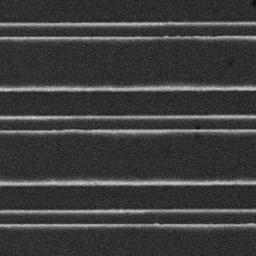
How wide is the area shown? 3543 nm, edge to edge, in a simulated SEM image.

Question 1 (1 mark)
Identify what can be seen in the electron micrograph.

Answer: lines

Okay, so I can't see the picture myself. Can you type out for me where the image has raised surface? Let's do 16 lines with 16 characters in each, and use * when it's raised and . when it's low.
................
................
****************
****************
****************
****************
................
................
****************
****************
****************
................
................
................
****************
****************